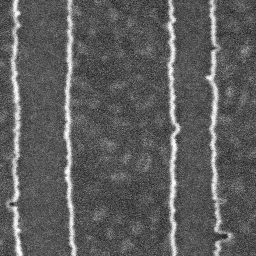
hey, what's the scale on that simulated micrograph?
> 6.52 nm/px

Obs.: one or a few lines or trenches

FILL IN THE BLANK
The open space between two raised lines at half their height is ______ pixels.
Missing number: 47.1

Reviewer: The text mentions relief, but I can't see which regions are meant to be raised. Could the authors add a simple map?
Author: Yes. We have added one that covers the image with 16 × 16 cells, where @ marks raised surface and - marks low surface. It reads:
@---@@@@@@@--@@@
@---@@@@@@@--@@@
@---@@@@@@@--@@@
@---@@@@@@@--@@@
@---@@@@@@@--@@@
@---@@@@@@@--@@@
@---@@@@@@@--@@@
@---@@@@@@@--@@@
@---@@@@@@@--@@@
@---@@@@@@@--@@@
@---@@@@@@@--@@@
@---@@@@@@@--@@@
@---@@@@@@@--@@@
@---@@@@@@@---@@
@---@@@@@@@---@@
@----@@@@@@---@@